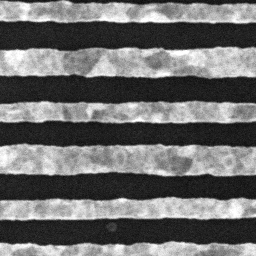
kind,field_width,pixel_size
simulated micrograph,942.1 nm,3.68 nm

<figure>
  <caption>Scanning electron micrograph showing lines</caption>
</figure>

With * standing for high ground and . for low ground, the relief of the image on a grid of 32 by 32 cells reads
*********..*.***....**..........
********************************
********************************
................................
................................
................................
********************************
********************************
********************************
...........*...******....*******
................................
................................
................................
********************************
********************************
................................
................................
................................
********************************
********************************
********************************
*************....***************
................................
................................
................................
********************************
********************************
................................
................................
................................
*..*......**.....**.****..**..**
********************************